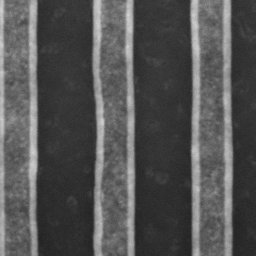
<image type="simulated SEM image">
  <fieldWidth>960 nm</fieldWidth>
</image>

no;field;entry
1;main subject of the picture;one or a few lines or trenches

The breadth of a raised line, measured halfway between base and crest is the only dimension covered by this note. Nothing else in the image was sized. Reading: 0.132 µm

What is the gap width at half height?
235 nm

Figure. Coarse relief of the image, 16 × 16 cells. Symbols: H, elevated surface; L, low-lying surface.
HHLLLLHHLLLLHHLL
HHLLLLHHLLLLHHLL
HHLLLLHHLLLLHHLL
HHLLLLHHLLLLHHLL
HHLLLLHHLLLLHHLL
HHLLLLHHLLLLHHLL
HHLLLLHHLLLLHHLL
HHLLLLHHLLLLHHLL
HHLLLLHHLLLLHHLL
HHLLLLHHLLLLHHLL
HHLLLLHHLLLLHHLL
HHLLLLHHLLLLHHLL
HHLLLLHHLLLLHHLL
HHLLLLHHLLLLHHLL
HHLLLLHHLLLLHHLL
HHLLLLHHLLLLHHLL